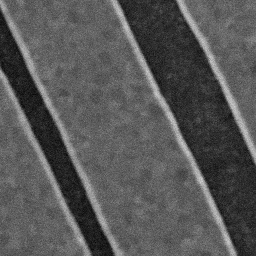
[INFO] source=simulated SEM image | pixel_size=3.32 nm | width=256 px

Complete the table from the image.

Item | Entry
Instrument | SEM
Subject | one or a few lines or trenches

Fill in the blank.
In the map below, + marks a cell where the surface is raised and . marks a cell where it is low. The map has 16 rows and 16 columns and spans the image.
+++++++....+++++
.+++++++....++++
.+++++++.....+++
..+++++++....+++
..+++++++.....++
+..+++++++....++
+..+++++++....++
+...+++++++....+
++..+++++++....+
++..++++++++....
+++..+++++++....
+++..++++++++...
++++..+++++++...
++++..++++++++..
+++++..+++++++..
+++++..+++++++..